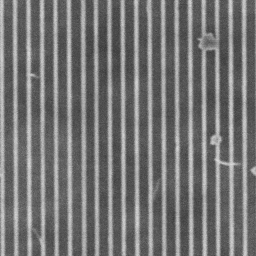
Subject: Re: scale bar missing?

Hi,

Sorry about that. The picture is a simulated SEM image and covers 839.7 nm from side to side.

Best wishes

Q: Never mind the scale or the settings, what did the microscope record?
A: parallel lines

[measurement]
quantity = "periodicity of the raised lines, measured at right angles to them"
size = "44.3 nm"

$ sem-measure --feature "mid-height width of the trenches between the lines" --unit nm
33.6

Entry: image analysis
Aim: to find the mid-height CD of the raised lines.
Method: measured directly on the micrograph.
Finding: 11.1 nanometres